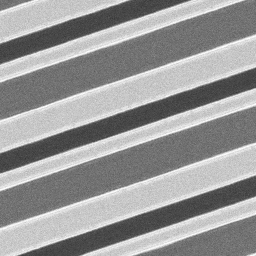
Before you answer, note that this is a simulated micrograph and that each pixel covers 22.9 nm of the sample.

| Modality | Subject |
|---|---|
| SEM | lines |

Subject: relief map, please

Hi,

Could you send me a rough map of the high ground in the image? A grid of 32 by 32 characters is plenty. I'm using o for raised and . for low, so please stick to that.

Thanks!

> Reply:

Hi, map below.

...oooooooooooo........oooooo...
oooooooooooo........oooooo......
ooooooooo........oooooo.........
oooooo........oooooo............
ooo........oooooo...............
........oooooo...............ooo
.....oooooo...............oooooo
..oooooo...............ooooooooo
ooooo...............oooooooooooo
oo...............oooooooooooo...
..............oooooooooooo......
...........oooooooooooo........o
........oooooooooooo........oooo
.....oooooooooooo........oooooo.
..ooooooooooo.........ooooo.....
oooooooooo.........oooooo.......
oooooooo........oooooo..........
ooooo........oooooo.............
oo........oooooo..............oo
.......oooooo..............ooooo
....oooooo...............ooooooo
.oooooo...............oooooooooo
oooo..............oooooooooooo..
o..............oooooooooooo.....
............oooooooooooo........
..........ooooooooooo........ooo
.......ooooooooooo.........ooooo
....ooooooooooo.........oooooo..
.ooooooooooo.........oooooo.....
ooooooooo.........oooooo........
oooooo........ooooooo...........
ooo........ooooooo..............